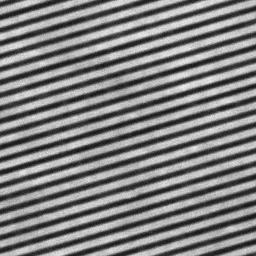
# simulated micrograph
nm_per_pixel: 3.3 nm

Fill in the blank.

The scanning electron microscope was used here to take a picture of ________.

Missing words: parallel lines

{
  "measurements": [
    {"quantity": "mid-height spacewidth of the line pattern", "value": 21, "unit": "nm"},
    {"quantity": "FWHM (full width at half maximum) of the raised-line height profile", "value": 21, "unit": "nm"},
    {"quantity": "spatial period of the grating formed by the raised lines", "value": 0.041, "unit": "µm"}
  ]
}